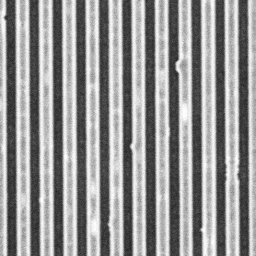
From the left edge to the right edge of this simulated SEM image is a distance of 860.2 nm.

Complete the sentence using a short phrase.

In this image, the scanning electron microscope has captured parallel lines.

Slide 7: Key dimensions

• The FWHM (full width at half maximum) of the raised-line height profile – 36.5 nm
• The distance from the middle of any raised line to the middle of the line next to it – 0.0779 microns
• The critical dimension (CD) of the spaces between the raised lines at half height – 39.8 nm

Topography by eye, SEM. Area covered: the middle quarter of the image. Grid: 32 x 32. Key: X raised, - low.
XXX---XX----XX---XXX---XXX--XXX-
XXX---XX----XX---XXX---XXX--XXX-
XXX---XX----XX---XXX---XXX---XX-
XXX---XX----XX---XXX---XXX---XX-
XXX---XX----XX---XXX---XXX---XX-
XXX---XX----XX---XXX---XXX---XX-
XXX---XX----XX---XXX---XXX---XX-
XXX---XX----XX---XXX---XXX---XX-
XXX---XX----XX---XXX---XXX---XX-
XXX---XX----XX---XXX---XXX---XX-
XXX---XX----XX---XXX---XXX---XX-
XXX---XX----XX---XXX---XXX---XX-
XXX---XX----XX---XXX---XXX---XX-
XXX---XXX---XX---XXX---XXX---XX-
XXX---XXX---XX---XXX---XXX---XX-
XXX---XXX---XX---XXX---XXX---XX-
XXX---XXX---XX---XXX---XXX---XX-
XXX---XXX---XX---XXX---XXX---XXX
XXX---XXX---XX---XXX---XXX---XXX
XXX---XXX---XX---XXX---XXX---XXX
XXX---XXX---XX---XXX---XXX---XXX
XXX---XXX---XX---XXX---XXX---XXX
XXX---XXX---XX---XXX---XXX---XXX
XXX---XXX---XX---XXX---XXX---XXX
XXX---XXX---XX---XXX---XXX---XXX
XXX---XXX---XX---XXX---XXX---XXX
XXX---XXX---XX---XXX---XXX---XXX
XXX---XXX---XX---XXX---XXX---XXX
XXX---XXX---XX---XXX---XXX---XXX
XXX---XXX---XX---XXX---XXX---XXX
XXX---XXX---XX---XXX---XXX---XXX
XXX---XXX---XX---XXX---XXX---XXX